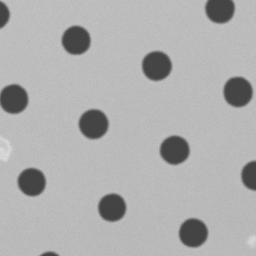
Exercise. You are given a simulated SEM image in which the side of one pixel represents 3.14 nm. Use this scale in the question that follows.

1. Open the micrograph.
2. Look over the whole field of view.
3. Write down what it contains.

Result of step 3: a regular array of holes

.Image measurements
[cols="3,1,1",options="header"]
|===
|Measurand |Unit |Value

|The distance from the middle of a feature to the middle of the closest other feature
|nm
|266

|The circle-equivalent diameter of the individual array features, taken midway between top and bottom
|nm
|89.3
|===